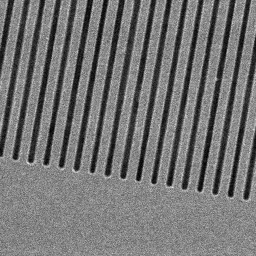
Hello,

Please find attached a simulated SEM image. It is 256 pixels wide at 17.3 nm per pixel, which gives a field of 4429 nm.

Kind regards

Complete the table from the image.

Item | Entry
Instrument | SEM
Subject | parallel lines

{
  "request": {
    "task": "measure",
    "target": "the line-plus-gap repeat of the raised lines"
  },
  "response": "270 nanometers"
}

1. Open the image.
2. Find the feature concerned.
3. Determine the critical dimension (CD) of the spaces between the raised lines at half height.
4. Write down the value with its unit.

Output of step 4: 98 nm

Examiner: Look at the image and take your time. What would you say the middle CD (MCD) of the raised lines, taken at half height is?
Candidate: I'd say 164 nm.